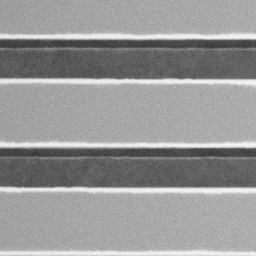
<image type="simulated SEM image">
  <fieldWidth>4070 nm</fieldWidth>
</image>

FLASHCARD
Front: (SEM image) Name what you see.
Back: lines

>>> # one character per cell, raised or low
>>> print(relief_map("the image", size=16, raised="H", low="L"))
HHHHHHHHHHHHHHHH
HHHHHHHHHHHHHHHH
LLLLLLLLLLLLLLLL
LLLLLLLLLLLLLLLL
LLLLLLLLLLLLLLLL
HHHHHHHHHHHHHHHH
HHHHHHHHHHHHHHHH
HHHHHHHHHHHHHHHH
HHHHHHHHHHHHHHHH
LLLLLLLLLLLLLLLL
LLLLLLLLLLLLLLLL
LLLLLLLLLLLLLLLL
HHHHHHHHHHHHHHHH
HHHHHHHHHHHHHHHH
HHHHHHHHHHHHHHHH
HHHHHHHHHHHHHHHH